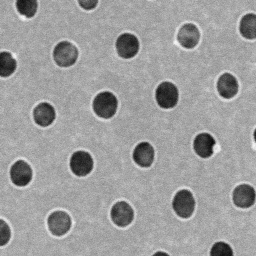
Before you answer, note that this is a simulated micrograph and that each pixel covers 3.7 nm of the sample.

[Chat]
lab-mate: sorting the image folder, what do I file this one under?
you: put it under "a regular array of holes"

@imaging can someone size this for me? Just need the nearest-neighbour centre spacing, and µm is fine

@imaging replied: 0.228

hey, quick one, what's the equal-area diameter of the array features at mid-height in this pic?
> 98.7 nm